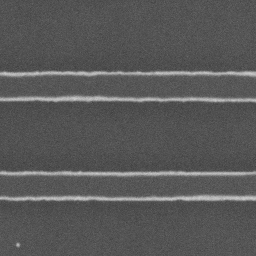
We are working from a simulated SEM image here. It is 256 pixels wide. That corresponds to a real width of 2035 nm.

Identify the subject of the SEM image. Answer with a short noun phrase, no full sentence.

lines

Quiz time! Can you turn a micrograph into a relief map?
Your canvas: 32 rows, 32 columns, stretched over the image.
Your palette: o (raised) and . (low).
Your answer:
................................
................................
................................
................................
................................
................................
................................
................................
................................
oooooooooooooooooooooooooooooooo
oooooooooooooooooooooooooooooooo
oooooooooooooooooooooooooooooooo
................oo.oo.o...oooooo
................................
................................
................................
................................
................................
................................
................................
................................
................................
oooooooooooooooooooooooooooooooo
oooooooooooooooooooooooooooooooo
oooooooooooooooooooooooooooooooo
................................
................................
................................
................................
................................
................................
................................